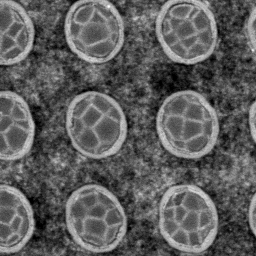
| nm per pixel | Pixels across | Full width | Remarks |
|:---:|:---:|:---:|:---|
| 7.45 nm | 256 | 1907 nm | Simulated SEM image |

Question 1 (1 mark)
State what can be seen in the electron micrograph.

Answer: raised bodies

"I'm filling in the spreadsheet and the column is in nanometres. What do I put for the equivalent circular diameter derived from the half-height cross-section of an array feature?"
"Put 454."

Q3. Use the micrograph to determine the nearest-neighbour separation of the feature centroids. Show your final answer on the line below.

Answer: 684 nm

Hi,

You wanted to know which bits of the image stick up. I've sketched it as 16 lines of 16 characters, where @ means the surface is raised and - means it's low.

@----@@---@@@---
@@--@@@@--@@@---
@@--@@@@--@@@---
@----@@----@@---
----------------
----------------
@@---@@---@@@---
@@--@@@@--@@@---
@@--@@@@--@@@---
@----@@----@@---
----------------
----------------
@@--@@@---@@@---
@@--@@@@--@@@---
@@--@@@@--@@@---
@----@@----@@---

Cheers